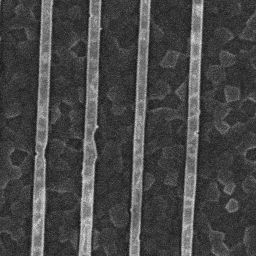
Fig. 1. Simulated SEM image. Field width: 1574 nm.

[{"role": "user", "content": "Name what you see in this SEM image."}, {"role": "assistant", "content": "parallel lines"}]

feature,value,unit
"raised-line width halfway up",60.7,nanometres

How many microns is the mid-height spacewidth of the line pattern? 0.244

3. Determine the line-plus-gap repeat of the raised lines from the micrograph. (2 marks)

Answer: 308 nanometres